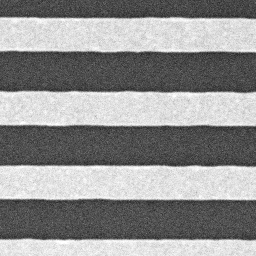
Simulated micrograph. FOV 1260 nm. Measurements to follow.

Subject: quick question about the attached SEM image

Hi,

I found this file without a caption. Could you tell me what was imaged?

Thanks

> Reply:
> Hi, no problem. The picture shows wiring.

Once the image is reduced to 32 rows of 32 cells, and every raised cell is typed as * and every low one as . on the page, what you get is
................................
................................
*******************************.
********************************
********************************
********************************
................................
................................
................................
................................
................................
................................
********************************
********************************
********************************
********************************
................................
................................
................................
................................
................................
********************************
********************************
********************************
********************************
................................
................................
................................
................................
................................
********************************
********************************